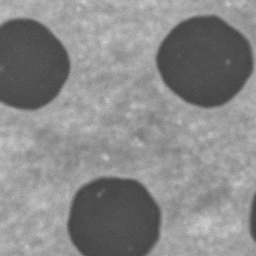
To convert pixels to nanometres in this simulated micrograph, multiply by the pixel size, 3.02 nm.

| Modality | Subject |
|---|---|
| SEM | holes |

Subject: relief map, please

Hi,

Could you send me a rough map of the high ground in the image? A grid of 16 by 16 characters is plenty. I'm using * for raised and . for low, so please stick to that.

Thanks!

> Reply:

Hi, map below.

****************
...********...**
....******.....*
....******......
....******......
....*******....*
...*********..**
****************
****************
****************
****************
*****....*******
*****.....******
****......******
****......******
*****.....******